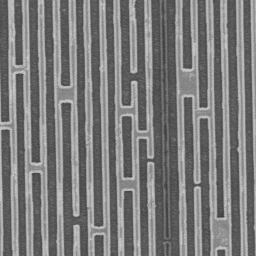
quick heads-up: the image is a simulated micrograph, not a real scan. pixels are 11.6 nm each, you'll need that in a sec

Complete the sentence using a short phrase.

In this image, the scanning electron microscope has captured parallel lines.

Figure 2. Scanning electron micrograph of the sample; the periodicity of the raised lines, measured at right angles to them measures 176 nanometers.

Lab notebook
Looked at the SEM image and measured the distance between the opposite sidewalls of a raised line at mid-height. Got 0.052 micrometres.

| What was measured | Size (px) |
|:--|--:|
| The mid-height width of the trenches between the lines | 10.8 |